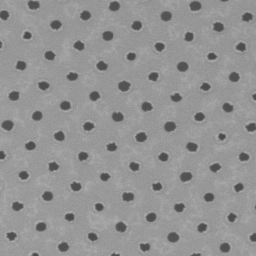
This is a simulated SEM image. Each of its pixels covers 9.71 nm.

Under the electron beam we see a regular array of holes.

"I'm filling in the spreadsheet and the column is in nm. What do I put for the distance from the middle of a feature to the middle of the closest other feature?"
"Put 293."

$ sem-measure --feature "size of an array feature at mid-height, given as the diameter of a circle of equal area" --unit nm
93.7